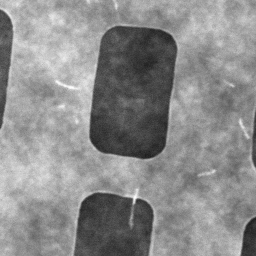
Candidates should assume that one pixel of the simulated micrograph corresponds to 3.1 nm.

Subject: holes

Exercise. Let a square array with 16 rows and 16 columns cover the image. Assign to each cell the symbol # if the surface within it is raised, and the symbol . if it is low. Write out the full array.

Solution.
################
.###############
.#####.....#####
.#####.....#####
.#####.....#####
######.....#####
######.....#####
######.....#####
######....######
######....######
################
################
#####....#######
#####.....######
#####.....#####.
#####....######.